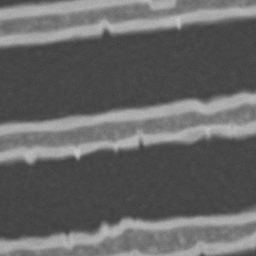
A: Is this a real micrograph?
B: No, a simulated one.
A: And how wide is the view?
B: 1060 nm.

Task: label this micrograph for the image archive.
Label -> one or a few lines or trenches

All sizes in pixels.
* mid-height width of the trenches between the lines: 87.9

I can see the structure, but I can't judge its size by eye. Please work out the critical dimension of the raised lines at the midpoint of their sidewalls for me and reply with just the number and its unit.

115 nanometres